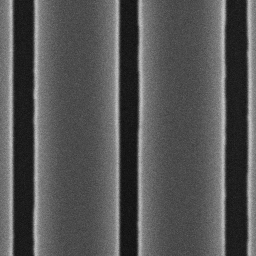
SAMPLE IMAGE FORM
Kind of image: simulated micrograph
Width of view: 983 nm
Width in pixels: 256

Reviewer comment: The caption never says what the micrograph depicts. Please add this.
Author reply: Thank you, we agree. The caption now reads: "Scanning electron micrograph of lines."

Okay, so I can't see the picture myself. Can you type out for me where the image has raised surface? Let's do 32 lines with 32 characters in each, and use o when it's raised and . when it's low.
oo..ooooooooooo..ooooooooooo...o
oo..ooooooooooo..ooooooooooo...o
oo..ooooooooooo..ooooooooooo...o
oo..ooooooooooo..ooooooooooo...o
oo..ooooooooooo..ooooooooooo...o
oo..ooooooooooo..ooooooooooo...o
oo..ooooooooooo..ooooooooooo...o
oo..ooooooooooo..ooooooooooo...o
oo..ooooooooooo..ooooooooooo...o
oo..ooooooooooo..ooooooooooo...o
oo..ooooooooooo..ooooooooooo...o
oo..ooooooooooo..ooooooooooo...o
oo..ooooooooooo..ooooooooooo...o
oo..ooooooooooo..ooooooooooo...o
oo..ooooooooooo..ooooooooooo...o
oo..ooooooooooo..ooooooooooo...o
oo..ooooooooooo..ooooooooooo...o
oo..ooooooooooo..ooooooooooo...o
oo..ooooooooooo..ooooooooooo...o
oo..ooooooooooo..ooooooooooo...o
oo..ooooooooooo..ooooooooooo...o
oo..ooooooooooo..ooooooooooo...o
oo..ooooooooooo..ooooooooooo...o
oo..ooooooooooo..ooooooooooo...o
oo..ooooooooooo..ooooooooooo...o
oo..ooooooooooo..ooooooooooo...o
oo..ooooooooooo..ooooooooooo...o
oo..ooooooooooo..ooooooooooo...o
oo..ooooooooooo..ooooooooooo...o
oo..ooooooooooo..ooooooooooo...o
oo..ooooooooooo..ooooooooooo...o
oo..ooooooooooo..ooooooooooo...o